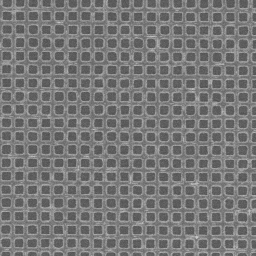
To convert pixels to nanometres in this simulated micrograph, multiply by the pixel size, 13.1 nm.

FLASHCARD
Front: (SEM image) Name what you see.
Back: a regular array of holes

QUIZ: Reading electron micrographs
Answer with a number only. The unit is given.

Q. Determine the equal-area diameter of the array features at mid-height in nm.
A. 130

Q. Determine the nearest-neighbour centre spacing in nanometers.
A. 170